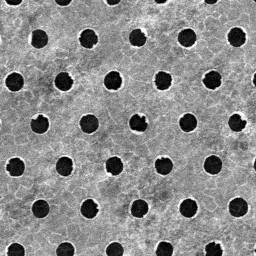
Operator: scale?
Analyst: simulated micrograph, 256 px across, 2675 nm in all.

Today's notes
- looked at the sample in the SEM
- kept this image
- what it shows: a regular array of holes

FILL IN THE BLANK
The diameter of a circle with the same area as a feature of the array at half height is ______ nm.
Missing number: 196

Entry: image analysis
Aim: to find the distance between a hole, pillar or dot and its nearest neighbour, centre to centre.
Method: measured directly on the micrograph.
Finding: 0.507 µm